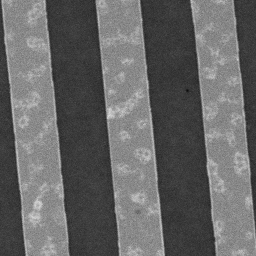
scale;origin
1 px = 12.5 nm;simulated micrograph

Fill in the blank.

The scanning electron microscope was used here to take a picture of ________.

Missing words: one or a few lines or trenches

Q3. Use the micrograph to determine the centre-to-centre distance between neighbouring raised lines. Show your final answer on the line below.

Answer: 1170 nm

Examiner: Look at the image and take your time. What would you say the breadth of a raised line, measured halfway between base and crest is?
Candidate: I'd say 42.2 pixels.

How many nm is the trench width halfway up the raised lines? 646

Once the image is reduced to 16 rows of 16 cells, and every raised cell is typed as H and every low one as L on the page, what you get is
HHHLLLHHHLLLHHHL
HHHLLLHHHLLLHHHL
HHHLLLHHHLLLHHHL
HHHLLLHHHLLLHHHL
LHHLLLHHHLLLHHHL
LHHLLLLHHLLLLHHL
LHHLLLLHHLLLLHHL
LHHLLLLHHLLLLHHL
LHHHLLLHHHLLLHHL
LHHHLLLHHHLLLHHL
LHHHLLLHHHLLLHHH
LHHHLLLHHHLLLHHH
LHHHLLLHHHLLLHHH
LHHHLLLHHHLLLHHH
LLHHLLLHHHLLLHHH
LLHHLLLLHHLLLLHH